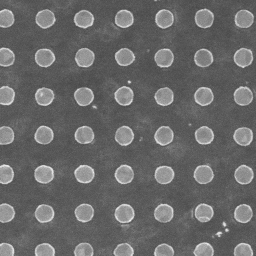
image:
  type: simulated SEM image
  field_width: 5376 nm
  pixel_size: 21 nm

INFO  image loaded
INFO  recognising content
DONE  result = a regular array of raised bodies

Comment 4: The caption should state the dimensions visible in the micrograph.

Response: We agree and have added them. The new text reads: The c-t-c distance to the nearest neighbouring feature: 813 nanometers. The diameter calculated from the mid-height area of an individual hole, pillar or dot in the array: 390 nanometres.